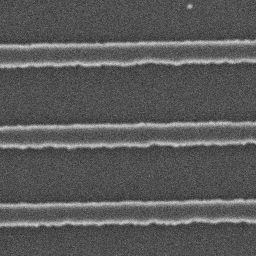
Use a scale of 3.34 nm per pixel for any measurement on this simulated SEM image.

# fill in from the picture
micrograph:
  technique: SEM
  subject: lines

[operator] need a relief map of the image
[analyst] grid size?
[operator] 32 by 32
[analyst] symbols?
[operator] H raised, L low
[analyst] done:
LLLLLLLLLLLLLLLLLLLLLLLLLLLLLLLL
LLLLLLLLLLLLLLLLLLLLLLLLLLLLLLLL
LLLLLLLLLLLLLLLLLLLLLLLLLLLLLLLL
LLLLLLLLLLLLLLLLLLLLLLLLLLLLLLLL
LLLLLLLLLLLLLLLLLLLLLLLLLLLLLLLL
LLLLLLLLLHHLHHHHHHHHHHHHHHHHHHHH
HHHHHHHHHHHHHHHHHHHHHHHHHHHHHHHH
HHHHHHHHHHHHHHHHHHHHHHHHHHHHHHHH
LLLLLLLLLLLLLLLLLLLLLLLLLLLLLLLL
LLLLLLLLLLLLLLLLLLLLLLLLLLLLLLLL
LLLLLLLLLLLLLLLLLLLLLLLLLLLLLLLL
LLLLLLLLLLLLLLLLLLLLLLLLLLLLLLLL
LLLLLLLLLLLLLLLLLLLLLLLLLLLLLLLL
LLLLLLLLLLLLLLLLLLLLLLLLLLLLLLLL
LLLLLLLLLLLLLLLLLLLLLLLLLLLLLLLL
LLLLLLLLLLLLLLLLLHLLLHHHHHHHHHHH
HHHHHHHHHHHHHHHHHHHHHHHHHHHHHHHH
HHHHHHHHHHHHHHHHHHHHHHHHHHHHHHHH
LLHLLLLLLLLLLLLLLLLLLLLLLLLLLLLL
LLLLLLLLLLLLLLLLLLLLLLLLLLLLLLLL
LLLLLLLLLLLLLLLLLLLLLLLLLLLLLLLL
LLLLLLLLLLLLLLLLLLLLLLLLLLLLLLLL
LLLLLLLLLLLLLLLLLLLLLLLLLLLLLLLL
LLLLLLLLLLLLLLLLLLLLLLLLLLLLLLLL
LLLLLLLLLLLLLLLLLLLLLLLLLLLLLLLL
LLHHLHHHHHHHHHHHHHHHHHHHHHHHHHHH
HHHHHHHHHHHHHHHHHHHHHHHHHHHHHHHH
HHHHHHHHHHHHHHHHHHHHHHHHHHHHHHHH
LLLLLLLLLLLLLLLLLLLLLLLLLLLLLLLL
LLLLLLLLLLLLLLLLLLLLLLLLLLLLLLLL
LLLLLLLLLLLLLLLLLLLLLLLLLLLLLLLL
LLLLLLLLLLLLLLLLLLLLLLLLLLLLLLLL